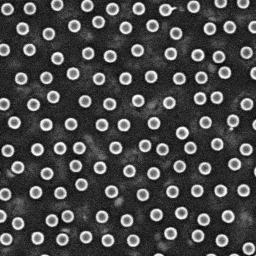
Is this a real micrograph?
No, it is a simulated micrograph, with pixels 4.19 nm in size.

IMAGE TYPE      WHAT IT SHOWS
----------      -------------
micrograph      a regular array of raised bodies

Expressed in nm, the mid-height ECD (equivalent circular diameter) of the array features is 47.5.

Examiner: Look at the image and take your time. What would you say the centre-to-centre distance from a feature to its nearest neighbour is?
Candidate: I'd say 91.9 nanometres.